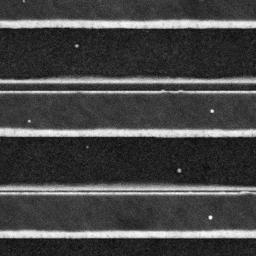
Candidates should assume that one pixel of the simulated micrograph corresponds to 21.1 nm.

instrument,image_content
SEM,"lines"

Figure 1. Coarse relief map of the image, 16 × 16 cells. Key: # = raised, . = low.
################
################
................
................
................
................
################
################
................
................
................
................
################
################
################
................